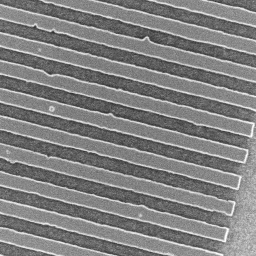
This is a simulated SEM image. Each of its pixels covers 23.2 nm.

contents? parallel lines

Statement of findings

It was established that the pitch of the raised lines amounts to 627 nanometers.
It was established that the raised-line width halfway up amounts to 13.8 px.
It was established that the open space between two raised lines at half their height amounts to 302 nanometers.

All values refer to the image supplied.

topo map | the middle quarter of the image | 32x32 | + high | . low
....++++++++++++++.............+
........+++++++++++++...........
............++++++++++++++......
++..............+++++++++++++...
+++++...............++++++++++++
++++++++++..............++++++++
+++++++++++++...............++++
....++++++++++++++..............
........++++++++++++++..........
............++++++++++++++......
++..............++++++++++++++..
++++++..............++++++++++++
++++++++++.+............++++++++
++++++++++++++..............++++
.....+++++++++++++.............+
........++++++++++++++..........
............++++++++++++++......
++...............+++++++++++++..
++++++..............++++++++++++
++++++++++..............++++++++
++++++++++++++...............+++
.....+++++++++++++..............
........++++++++++++++..........
.............+++++++++++++......
++..............++++++++++++++..
++++++..............++++++++++++
++++++++++...............+++++++
++++++++++++++...............+++
....++++++++++++++..............
........++++++++++++++..........
............++++++++++++++......
++...............+++++++++++++..